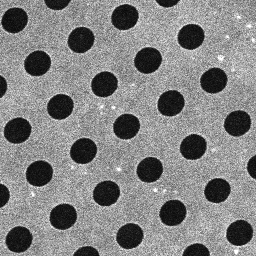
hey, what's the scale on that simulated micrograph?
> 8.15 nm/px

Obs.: a regular array of holes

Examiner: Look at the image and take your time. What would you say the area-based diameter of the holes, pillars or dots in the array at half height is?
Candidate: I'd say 219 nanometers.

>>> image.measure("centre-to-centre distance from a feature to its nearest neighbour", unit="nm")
398